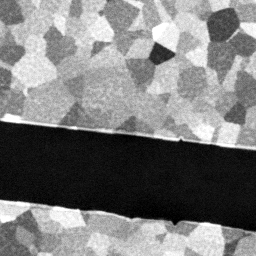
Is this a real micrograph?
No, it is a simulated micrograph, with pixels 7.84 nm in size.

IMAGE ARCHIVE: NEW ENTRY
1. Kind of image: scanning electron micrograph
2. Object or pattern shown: one or a few lines or trenches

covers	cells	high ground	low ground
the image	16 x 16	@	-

@@@@@@@@@@@@@@@@
@@@@@@@@@@@@@@@@
@@@@@@@@@@@@@@@@
@@@@@@@@@@@@@@@@
@@@@@@@@@@@@@@@@
@@@@@@@@@@@@@@@@
@@@@@@@@@@@@@@@@
-@@@@@@@@@@@@@@@
---------@@@@@@@
----------------
----------------
----------------
----------------
@@@@@@@---------
@@@@@@@@@@@@@@@@
@@@@@@@@@@@@@@@@